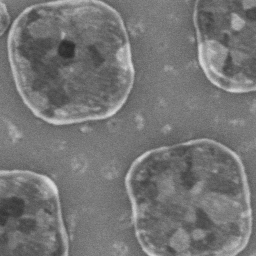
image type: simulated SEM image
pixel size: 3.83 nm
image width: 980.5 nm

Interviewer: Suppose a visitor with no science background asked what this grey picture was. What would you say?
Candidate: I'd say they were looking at raised bodies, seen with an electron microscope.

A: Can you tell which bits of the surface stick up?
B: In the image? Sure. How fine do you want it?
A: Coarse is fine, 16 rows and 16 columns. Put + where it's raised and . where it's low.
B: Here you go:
..+++++.....++++
.+++++++....++++
.+++++++....++++
.+++++++....++++
.+++++++.....+++
.+++++++......++
..++++++........
...++...........
................
.........+++++..
........+++++++.
+++.....+++++++.
++++....++++++++
++++....++++++++
++++....++++++++
++++.....++++++.